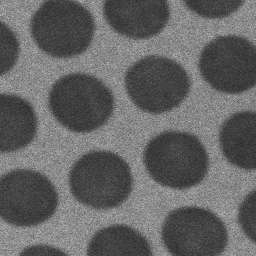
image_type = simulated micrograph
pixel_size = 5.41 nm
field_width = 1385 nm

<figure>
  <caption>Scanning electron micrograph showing holes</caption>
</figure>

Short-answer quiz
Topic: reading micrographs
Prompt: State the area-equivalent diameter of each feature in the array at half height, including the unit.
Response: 336 nanometers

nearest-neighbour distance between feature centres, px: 77.9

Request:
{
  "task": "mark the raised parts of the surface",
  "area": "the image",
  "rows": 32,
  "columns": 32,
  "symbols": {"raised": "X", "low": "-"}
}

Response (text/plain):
XXXXX-----XXX--------XX-------XX
XXXX-------XX--------XXX-----XXX
XXXX--------X--------XXXXXXXXXXX
-XXX--------XX------XXXXXXXXXXXX
--XX--------XXXX---XXXXXXXXX--XX
--XXX------XXXXXXXXXXXXXXX------
--XXX-----XXXXXXXXXXXXXXX-------
--XXXXXXXXXXXXXXX-----XXX-------
--XXXXXXXXXXXXXX-------XX-------
XXXXXXXX----XXXX--------X-------
XXXXXXX------XXX--------XX------
XXXXXX--------XX--------XXXX--XX
---XXX--------XX-------XXXXXXXXX
----XX--------XXX-----XXXXXXXXXX
----XXX-------XXXXXXXXXXXXXXX---
-----XXX-----XXXXXXXXXXXXXXX----
-----XXXX--XXXXXXXXX---XXXX-----
----XXXXXXXXXXXXXXX------XX-----
---XXXXXXXXXXXXXXX--------XX----
XXXXXXXXXX-----XXX--------XX----
XXXXXXXXX-------XX--------XXX---
X----XXXX-------XX--------XXXXXX
------XX---------XX------XXXXXXX
-------XX-------XXXXX---XXXXXXXX
-------XX-------XXXXXXXXXXXXXXX-
-------XXX-----XXXXXXXXXXXXXXX--
-------XXXXXXXXXXXXXX------XXX--
------XXXXXXXXXXXXXXX-------XX--
XXXXXXXXXXXXX----XXX--------XX--
XXXXXXXXXXXX------XX--------XXX-
XXXXXXXXXXX--------X--------XXXX
XXX-----XXX--------XX-------XXXX